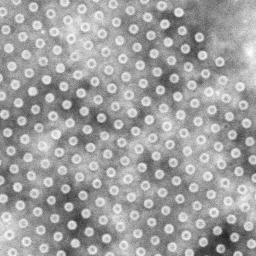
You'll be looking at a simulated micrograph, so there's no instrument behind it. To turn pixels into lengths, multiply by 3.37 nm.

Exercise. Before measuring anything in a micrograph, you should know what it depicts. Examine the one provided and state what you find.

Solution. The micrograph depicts a regular array of raised bodies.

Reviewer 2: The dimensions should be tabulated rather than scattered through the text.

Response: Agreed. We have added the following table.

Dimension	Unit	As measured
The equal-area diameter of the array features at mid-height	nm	27.9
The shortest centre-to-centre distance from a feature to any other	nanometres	60.7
